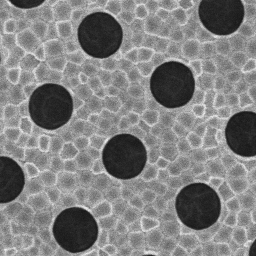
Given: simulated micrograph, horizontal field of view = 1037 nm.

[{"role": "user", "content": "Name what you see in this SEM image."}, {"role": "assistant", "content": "holes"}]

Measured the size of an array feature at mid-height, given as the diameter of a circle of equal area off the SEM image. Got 186 nm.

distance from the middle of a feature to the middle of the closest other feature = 351 nm